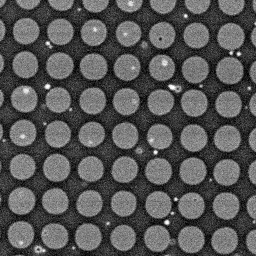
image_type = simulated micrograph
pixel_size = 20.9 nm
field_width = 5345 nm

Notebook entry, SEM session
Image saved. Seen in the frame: an array of small figures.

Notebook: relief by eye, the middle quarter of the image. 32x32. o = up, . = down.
oo..ooooooo..oooooo..ooooooo..oo
oo..ooooooo..oooooo..ooooooo..oo
o....ooooo...oooooo...ooooo...oo
......ooo.....oooo.....ooo....oo
................................
................................
......ooo.....ooo...............
o...oooooo...ooooo....ooooo...oo
o...oooooo...oooooo..oooooo...oo
o...oooooo..ooooooo..oooooo..ooo
o...oooooo...oooooo..oooooo...oo
.....oooo....ooooo....oooo....oo
...............oo......oo......o
................................
................................
o....oooo....oooo.....ooo......o
o...oooooo...ooooo...ooooo....oo
o...oooooo..oooooo...oooooo..ooo
o...oooooo..oooooo...oooooo..ooo
o...ooooo....ooooo...oooooo..ooo
......oo......ooo.....oooo....oo
...............................o
................................
......oo......ooo...............
o...ooooo....ooooo...ooooo....oo
o...oooooo..oooooo...oooooo..ooo
o...oooooo..oooooo...oooooo..ooo
o...oooooo..oooooo...oooooo..ooo
.....oooo....ooooo...ooooo...ooo
......................ooo.....oo
................................
................................